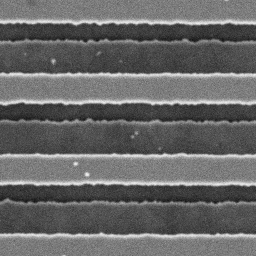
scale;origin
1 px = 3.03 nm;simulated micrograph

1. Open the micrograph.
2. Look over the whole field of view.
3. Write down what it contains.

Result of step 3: lines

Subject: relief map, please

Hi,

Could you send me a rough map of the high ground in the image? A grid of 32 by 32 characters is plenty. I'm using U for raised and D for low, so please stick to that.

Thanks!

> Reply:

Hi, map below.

UUUUUUUUUUUUUUUUUUUUUUUUUUUUUUUU
UUUUUUUUUUUUUUUUUUUUUUUUUUUUUUUU
UUUUUUUUUUUUUUUUUUUUUUUUUUUUUUUU
DDDDDDDDDDDDDDDDDDDDDDDDDDDDDDDD
DDDDDDDDDDDDDDDDDDDDDDDDDDDDDDDD
DDDDDDDDDDDDDDDDDDDDDDDDDDDDDDDD
DDDDDDDDDDDDDDDDDDDDDDDDDDDDDDDD
DDDDDDDDDDDDDDDDDDDDDDDDDDDDDDDD
DDDDDDDDDDDDDDDDDDDDDDDDDDDDDDDD
UUUUUUUUUUUUUUUUUUUUUUUUUUUUUUUU
UUUUUUUUUUUUUUUUUUUUUUUUUUUUUUUU
UUUUUUUUUUUUUUUUUUUUUUUUUUUUUUUU
UUUUUUUUUUUUUUUUUUUUUUUUUUUUUUUU
DDDDDDDDDDDDDDDDDDDDDDDDDDDDDDDD
DDDDDDDDDDDDDDDDDDDDDDDDDDDDDDDD
DDDDDDDDDDDDDDDDDDDDDDDDDDDDDDDD
DDDDDDDDDDDDDDDDDDDDDDDDDDDDDDDD
DDDDDDDDDDDDDDDDDDDDDDDDDDDDDDDD
DDDDDDDDDDDDDDDDDDDDDDDDDDDDDDDD
UUUUUUUUUUUUUUUUUUUUUUUUUUUUUUUU
UUUUUUUUUUUUUUUUUUUUUUUUUUUUUUUU
UUUUUUUUUUUUUUUUUUUUUUUUUUUUUUUU
UUUUUUUUUUUUUUUUUUUUUUUUUUUUUUUU
DDDDDDDDDDDDDDDDDDDDDDDDDDDDDDDD
DDDDDDDDDDDDDDDDDDDDDDDDDDDDDDDD
DDDDDDDDDDDDDDDDDDDDDDDDDDDDDDDD
DDDDDDDDDDDDDDDDDDDDDDDDDDDDDDDD
DDDDDDDDDDDDDDDDDDDDDDDDDDDDDDDD
DDDDDDDDDDDDDDDDDDDDDDDDDDDDDDDD
UUUUUUUUUUUUUUUUUUUUUUUUUUUUUUUU
UUUUUUUUUUUUUUUUUUUUUUUUUUUUUUUU
UUUUUUUUUUUUUUUUUUUUUUUUUUUUUUUU